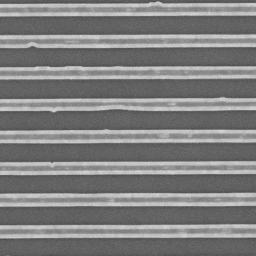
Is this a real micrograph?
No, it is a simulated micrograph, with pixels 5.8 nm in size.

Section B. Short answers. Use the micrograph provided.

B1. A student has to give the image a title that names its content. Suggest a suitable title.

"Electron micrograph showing parallel lines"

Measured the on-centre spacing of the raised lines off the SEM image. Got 184 nm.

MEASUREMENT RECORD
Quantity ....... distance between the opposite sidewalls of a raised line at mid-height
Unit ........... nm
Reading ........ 57.3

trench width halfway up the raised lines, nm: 127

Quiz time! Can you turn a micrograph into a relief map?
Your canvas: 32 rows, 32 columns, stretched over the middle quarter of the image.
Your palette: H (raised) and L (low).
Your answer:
LLLLLLLLLLLLLLLLLLLLLLLLLLLLLLLL
HHHHHHHHHHHHHHHHHHHHHHHHHHHHHHHH
HHHHHHHHHHHHHHHHHHHHHHHHHHHHHHHH
LLLLLLLLLLLLLLLLLLLLLLLLLLLLLLLL
LLLLLLLLLLLLLLLLLLLLLLLLLLLLLLLL
LLLLLLLLLLLLLLLLLLLLLLLLLLLLLLLL
LLLLLLLLLLLLLLLLLLLLLLLLLLLLLLLL
LLLLLLLLLLLLLLLLLLLLLLLLLLLLLLLL
LLLLLLLLLLLLLLLLLLLLLLLLLLLLLLLL
HHHHHHHHHHHHHHHHHHHHHHHHHHHHHHHH
HHHHHHHHHHHHHHHHHHHHHHHHHHHHHHHH
LLLLLLLLLLLLLLLLLLLLLLLLLLLLLLLL
LLLLLLLLLLLLLLLLLLLLLLLLLLLLLLLL
LLLLLLLLLLLLLLLLLLLLLLLLLLLLLLLL
LLLLLLLLLLLLLLLLLLLLLLLLLLLLLLLL
LLLLLLLLLLLLLLLLLLLLLLLLLLLLLLLL
LLLLLLLLLLLLLLLLLLLLLLLLLLLLLLLL
HHHHHHHHHHHHHHHHHHHHHHHHHHHHHHHH
HHHHHHHHHHHHHHHHHHHHHHHHHHHHHHHH
LLLLLLLLLLLLLLLLLLLLLLLLLLLLLLLL
LLLLLLLLLLLLLLLLLLLLLLLLLLLLLLLL
LLLLLLLLLLLLLLLLLLLLLLLLLLLLLLLL
LLLLLLLLLLLLLLLLLLLLLLLLLLLLLLLL
LLLLLLLLLLLLLLLLLLLLLLLLLLLLLLLL
LLLLLLLLLLLLLLLLLLLLLLLLLLLLLLLL
HHHHHHHHHHHHHHHHHHHHHHHHHHHHHHHH
HHHHHHHHHHHHHHHHHHHHHHHHHHHHHHHH
LLLLLLLLLLLLLLLLLLLLLLLLLLLLLLLL
LLLLLLLLLLLLLLLLLLLLLLLLLLLLLLLL
LLLLLLLLLLLLLLLLLLLLLLLLLLLLLLLL
LLLLLLLLLLLLLLLLLLLLLLLLLLLLLLLL
LLLLLLLLLLLLLLLLLLLLLLLLLLLLLLLL